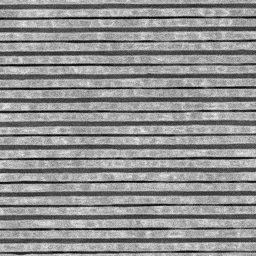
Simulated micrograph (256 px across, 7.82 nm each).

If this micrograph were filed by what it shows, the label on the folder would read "parallel lines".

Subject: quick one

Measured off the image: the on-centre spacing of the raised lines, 91.6 nm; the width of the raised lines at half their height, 8.5 px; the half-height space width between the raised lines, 33.2 nanometers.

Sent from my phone